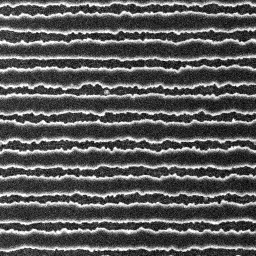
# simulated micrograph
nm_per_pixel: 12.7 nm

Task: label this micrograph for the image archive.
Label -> parallel lines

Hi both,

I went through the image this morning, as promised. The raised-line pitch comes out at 27.1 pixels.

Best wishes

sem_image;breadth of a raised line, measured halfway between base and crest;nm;244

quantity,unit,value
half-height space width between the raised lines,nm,108